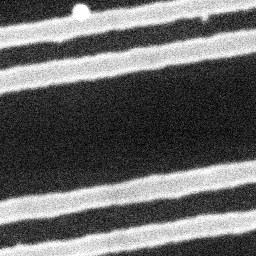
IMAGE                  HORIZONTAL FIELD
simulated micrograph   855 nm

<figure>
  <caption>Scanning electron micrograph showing lines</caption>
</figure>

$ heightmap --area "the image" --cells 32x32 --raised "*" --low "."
...................*************
.........**..***************....
......****************..........
****************................
*********..................*****
***...................**********
................***************.
........*****************.......
..******************............
*************...................
*******.........................
................................
................................
................................
................................
................................
................................
................................
................................
................................
..............................**
.......................*********
.................***************
............****************....
.....******************.........
***************.................
*********......................*
**.....................*********
.................***************
............**************......
.....***************............
**************..................